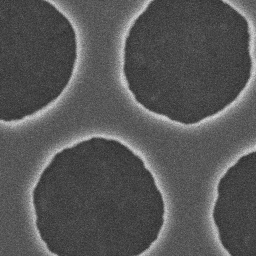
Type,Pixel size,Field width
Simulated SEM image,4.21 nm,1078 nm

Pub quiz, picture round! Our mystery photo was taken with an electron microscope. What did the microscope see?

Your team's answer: holes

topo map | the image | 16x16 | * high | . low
...******......*
....****.......*
.....***........
.....***........
.....***........
....****.......*
...******.....**
.**********..***
****************
****....********
***......*****..
**........****..
**........****..
**........***...
**........****..
***......*****..